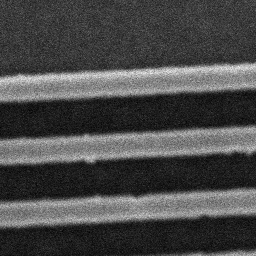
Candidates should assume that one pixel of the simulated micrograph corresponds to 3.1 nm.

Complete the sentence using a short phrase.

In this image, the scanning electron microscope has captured parallel lines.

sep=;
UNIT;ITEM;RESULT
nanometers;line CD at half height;74.6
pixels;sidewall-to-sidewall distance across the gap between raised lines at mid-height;38.8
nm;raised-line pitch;193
